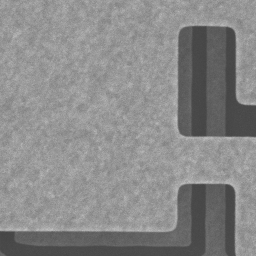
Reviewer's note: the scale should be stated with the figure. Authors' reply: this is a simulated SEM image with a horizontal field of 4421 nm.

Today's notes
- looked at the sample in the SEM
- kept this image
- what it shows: wiring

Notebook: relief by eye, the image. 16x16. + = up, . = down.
++++++++++++++++
++++++++++++++++
+++++++++++....+
+++++++++++....+
+++++++++++....+
+++++++++++....+
+++++++++++....+
+++++++++++.....
++++++++++++....
++++++++++++++++
++++++++++++++++
++++++++++++..++
+++++++++++....+
+++++++++++....+
...............+
...............+